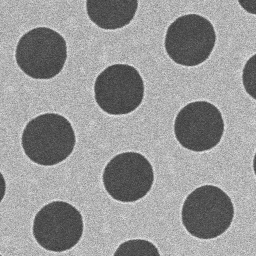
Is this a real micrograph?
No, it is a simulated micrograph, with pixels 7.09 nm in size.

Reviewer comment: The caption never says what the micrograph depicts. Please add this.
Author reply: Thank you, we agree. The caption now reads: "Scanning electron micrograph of a regular array of holes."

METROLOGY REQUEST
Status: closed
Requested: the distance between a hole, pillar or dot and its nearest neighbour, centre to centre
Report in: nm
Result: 611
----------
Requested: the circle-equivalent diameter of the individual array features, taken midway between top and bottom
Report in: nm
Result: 366